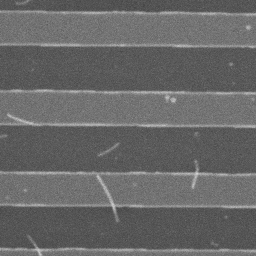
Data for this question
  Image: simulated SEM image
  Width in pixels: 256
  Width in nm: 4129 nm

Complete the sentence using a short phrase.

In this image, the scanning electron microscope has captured lines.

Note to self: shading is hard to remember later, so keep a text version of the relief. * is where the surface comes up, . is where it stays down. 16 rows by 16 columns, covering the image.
................
****************
****************
................
................
................
****************
****************
................
................
................
****************
****************
................
................
................